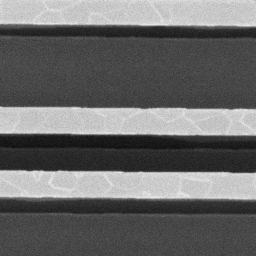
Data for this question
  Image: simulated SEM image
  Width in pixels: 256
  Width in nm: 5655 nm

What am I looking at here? lines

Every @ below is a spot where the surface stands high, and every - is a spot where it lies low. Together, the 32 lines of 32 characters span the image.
@@@@@@@@@@@@@@@@@@@@@@@@@@@@@@@@
@@@@@@@@@@@@@@@@@@@@@@@@@@@@@@@@
@@@@@@@@@@@@@@@@@@@@@@@@@@@@@@@@
--------------------------------
--------------------------------
--------------------------------
--------------------------------
--------------------------------
--------------------------------
--------------------------------
--------------------------------
--------------------------------
--------------------------------
@-------------------------------
@@@@@@@@@@@@@@@@@@@@@@@@@@@@@@@@
@@@@@@@@@@@@@@@@@@@@@@@@@@@@@@@@
@@@@@@@@@@@@@@@@@@@@@@@@@@@@@@@@
--------------------------------
--------------------------------
--------------------------------
--------------------------------
@@@@@@-@------------------------
@@@@@@@@@@@@@@@@@@@@@@@@@@@@@@@@
@@@@@@@@@@@@@@@@@@@@@@@@@@@@@@@@
@@@@@@@@@@@@@@@@@@@@@@@@@@@@@@@@
--------------------------------
--------------------------------
--------------------------------
--------------------------------
--------------------------------
--------------------------------
--------------------------------